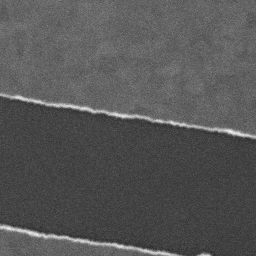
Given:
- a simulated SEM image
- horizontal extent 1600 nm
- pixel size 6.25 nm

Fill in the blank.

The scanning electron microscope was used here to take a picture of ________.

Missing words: one or a few lines or trenches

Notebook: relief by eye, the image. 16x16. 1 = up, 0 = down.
1111111111111111
1111111111111111
1111111111111111
1111111111111111
1111111111111111
1111111111111111
0001111111111111
0000000001111111
0000000000000000
0000000000000000
0000000000000000
0000000000000000
0000000000000000
0000000000000000
1100000000000000
1111111100000000